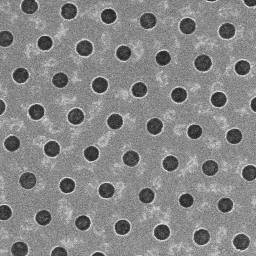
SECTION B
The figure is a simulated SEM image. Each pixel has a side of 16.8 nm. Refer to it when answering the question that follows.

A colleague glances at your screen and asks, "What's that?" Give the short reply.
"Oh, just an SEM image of a regular array of holes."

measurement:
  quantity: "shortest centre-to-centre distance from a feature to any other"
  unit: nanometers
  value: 668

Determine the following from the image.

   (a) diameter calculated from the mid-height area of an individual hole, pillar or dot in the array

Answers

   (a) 0.27 µm